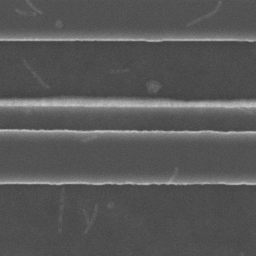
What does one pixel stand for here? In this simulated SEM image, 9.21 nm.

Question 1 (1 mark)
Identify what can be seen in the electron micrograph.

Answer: lines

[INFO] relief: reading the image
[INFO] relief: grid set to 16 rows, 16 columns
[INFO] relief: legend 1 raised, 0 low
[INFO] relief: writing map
1111111111111111
1111111111111111
1111111111111111
0000000000000000
0000000000000000
0000000000000000
0000000000000000
1111111111111111
1111111111111111
1111111111111111
1111111111111111
0000011001110011
0000000000000000
0000000000000000
0000000000000000
0000000000000000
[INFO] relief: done